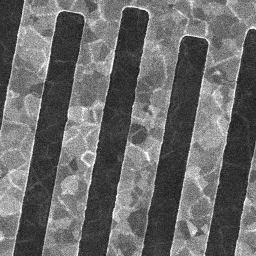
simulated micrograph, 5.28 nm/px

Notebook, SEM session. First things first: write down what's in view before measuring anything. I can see one or a few lines or trenches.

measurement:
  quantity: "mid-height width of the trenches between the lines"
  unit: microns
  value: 0.149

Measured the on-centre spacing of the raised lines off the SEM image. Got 333 nm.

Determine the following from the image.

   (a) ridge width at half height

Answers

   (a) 184 nm